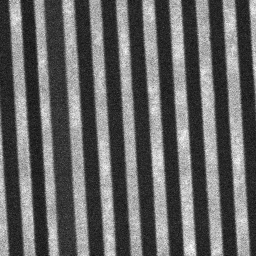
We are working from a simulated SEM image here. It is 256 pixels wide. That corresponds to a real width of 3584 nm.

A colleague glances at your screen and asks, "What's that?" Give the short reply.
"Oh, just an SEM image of parallel lines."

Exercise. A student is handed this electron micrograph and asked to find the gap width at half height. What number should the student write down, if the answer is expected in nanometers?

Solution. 201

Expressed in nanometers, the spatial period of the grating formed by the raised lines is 374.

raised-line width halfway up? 173 nanometres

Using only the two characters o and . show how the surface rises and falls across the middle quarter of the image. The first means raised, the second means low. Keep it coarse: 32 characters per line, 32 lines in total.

.oo....ooo....ooo...oooo...ooo..
.ooo...ooo....ooo...oooo...ooo..
.ooo...ooo....ooo....ooo...ooo..
.ooo...ooo....ooo....ooo....oo..
.ooo....oo....ooo....ooo....oo..
.ooo....oo....ooo....ooo....oo..
.ooo....ooo...ooo....ooo....oo..
.ooo....ooo...ooo....ooo....oo..
.ooo....ooo...ooo....ooo....ooo.
.ooo....ooo....oo....ooo....ooo.
.ooo....ooo....oo....ooo....ooo.
.ooo....ooo....oo....ooo....ooo.
.ooo....ooo....oo....ooo....ooo.
.ooo....ooo....oo....ooo....ooo.
.ooo....ooo....oo.....oo....ooo.
.ooo....ooo....ooo....oo....ooo.
..oo....ooo....ooo....ooo...ooo.
..oo....ooo....ooo....ooo...ooo.
..ooo...ooo....ooo....ooo...ooo.
..ooo...ooo....ooo....ooo....oo.
..ooo...ooo....ooo....ooo....oo.
..ooo....oo....ooo....ooo....oo.
..ooo....oo....ooo....ooo....ooo
..ooo....ooo...ooo....ooo....ooo
..ooo....ooo...ooo....ooo....ooo
..ooo....ooo...ooo....ooo....ooo
..ooo....ooo....oo....ooo....ooo
..ooo....ooo....oo....ooo....ooo
..ooo....ooo....oo....ooo....ooo
..ooo....ooo....oo....ooo....ooo
..ooo....ooo....oo....ooo....ooo
..ooo....ooo....oo.....oo....ooo